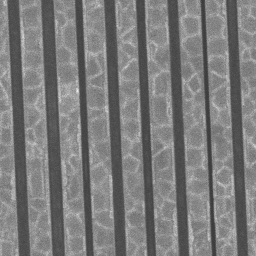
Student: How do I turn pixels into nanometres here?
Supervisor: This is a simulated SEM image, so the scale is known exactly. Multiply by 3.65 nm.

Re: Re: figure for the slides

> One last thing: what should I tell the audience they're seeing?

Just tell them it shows parallel lines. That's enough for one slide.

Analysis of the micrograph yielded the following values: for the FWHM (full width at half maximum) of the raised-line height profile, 78.8 nm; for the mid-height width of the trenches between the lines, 0.041 um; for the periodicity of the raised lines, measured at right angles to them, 0.113 µm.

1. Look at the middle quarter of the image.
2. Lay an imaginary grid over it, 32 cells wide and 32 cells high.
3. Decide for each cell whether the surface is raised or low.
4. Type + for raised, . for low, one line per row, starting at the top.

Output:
+++..++++++...++++...+++++...+++
+++...+++++...++++...+++++...+++
+++...+++++...++++...+++++....++
++++..+++++...+++++..++++++...++
++++..+++++...+++++..++++++...++
++++..+++++...+++++..++++++...++
++++..+++++...+++++..++++++...++
++++..+++++...+++++..++++++...++
++++..+++++...+++++..++++++...++
++++..+++++...+++++..++++++...++
++++..+++++...+++++..++++++...++
++++..+++++...+++++..++++++...++
++++..+++++...+++++...+++++...++
++++..+++++...+++++...+++++...++
++++..+++++...+++++...+++++...++
++++..+++++...+++++...+++++...++
++++..+++++...+++++...+++++...++
++++..+++++...+++++...+++++...++
++++..+++++....++++...+++++...++
++++..+++++....++++...+++++...++
++++..+++++....++++...+++++...++
++++..+++++....++++...+++++...++
++++..+++++....++++...+++++...++
++++...++++....++++...+++++...++
++++...+++++...++++...+++++...++
+++++..+++++...+++++..++++++...+
+++++..+++++...+++++..++++++...+
+++++..+++++...+++++..++++++...+
+++++..+++++...+++++..++++++...+
+++++..+++++...+++++..++++++...+
+++++..+++++...+++++..++++++...+
+++++..+++++...+++++..++++++...+